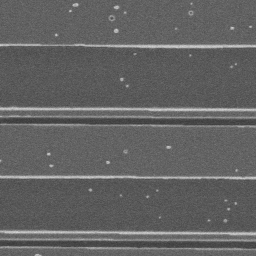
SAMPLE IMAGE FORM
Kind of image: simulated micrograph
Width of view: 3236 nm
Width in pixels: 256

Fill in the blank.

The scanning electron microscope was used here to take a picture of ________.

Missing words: lines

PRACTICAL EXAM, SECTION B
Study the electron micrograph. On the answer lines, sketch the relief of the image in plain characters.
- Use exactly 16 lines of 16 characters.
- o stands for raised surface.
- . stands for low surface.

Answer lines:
oooooooooooooooo
oooooooooooooooo
oooooooooooooooo
................
................
................
................
oooooooooooooooo
oooooooooooooooo
oooooooooooooooo
oooooooooooooooo
................
................
................
................
oooooooooooooooo